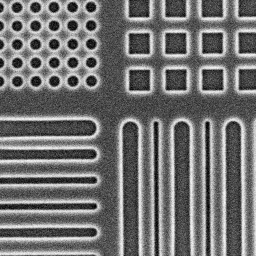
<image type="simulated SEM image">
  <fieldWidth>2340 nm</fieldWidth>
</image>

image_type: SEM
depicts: groups of lines, slits or small figures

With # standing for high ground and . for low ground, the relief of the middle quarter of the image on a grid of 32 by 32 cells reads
#..###..########################
################.....####......#
################......###......#
#..###..########......###......#
#...#...########......###......#
#..###..########......###......#
################.....####......#
################################
################################
################################
################################
################################
################################
################################
........########..##########...#
........#######....###..###....#
........######.....###..###.....
........######.....###..###.....
##############.....###..###.....
##############.....###..###.....
##############.....###..###.....
........######.....###..###.....
........######.....###..###.....
........######.....###..###.....
##############.....###..###.....
##############.....###..###.....
##############.....###..###.....
##############.....###..###.....
........######.....###..###.....
........######.....###..###.....
##############.....###..###.....
##############.....###..###.....